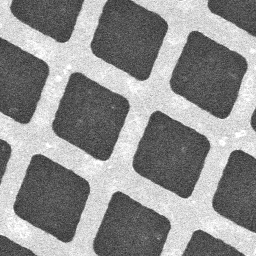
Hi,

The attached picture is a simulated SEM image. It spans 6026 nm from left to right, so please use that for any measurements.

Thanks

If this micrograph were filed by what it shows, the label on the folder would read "holes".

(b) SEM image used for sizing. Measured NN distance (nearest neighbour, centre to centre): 2090 nanometers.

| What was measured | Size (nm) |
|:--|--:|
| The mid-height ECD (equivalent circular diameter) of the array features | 1770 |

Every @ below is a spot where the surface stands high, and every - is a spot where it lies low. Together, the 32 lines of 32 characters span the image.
@---------@@@----@@@@@@@@@------
@---------@@@------@@@@@@@------
@@--------@@---------@@@@@@@----
@@@@-----@@@---------@@@@@@@@@--
@@@@@@---@@@---------@@---@@@@@@
--@@@@@@@@@---------@@@-----@@@@
---@@@@@@@@---------@@@-------@@
-----@@@@@@@@-------@@---------@
------@@@@@@@@@----@@@---------@
------@@@--@@@@@---@@---------@@
------@@----@@@@@@@@@---------@@
-----@@@------@@@@@@@@--------@@
-----@@@--------@@@@@@@-------@@
----@@@---------@@@@@@@@@----@@@
@---@@@---------@@@--@@@@@@--@@-
@@@@@@----------@@-----@@@@@@@@-
@@@@@@@--------@@@-------@@@@@@@
@@@@@@@@-------@@---------@@@@@@
-@@@@@@@@@----@@@---------@@@@@@
-@@@--@@@@@---@@@---------@@@---
-@@@---@@@@@@@@@@---------@@----
-@@------@@@@@@@@--------@@@----
@@@--------@@@@@@@@------@@-----
@@---------@@@@@@@@@----@@@-----
@@---------@@@--@@@@@@--@@@-----
@@---------@@@----@@@@@@@@@-----
@@--------@@@-------@@@@@@@-----
@@@-------@@@--------@@@@@@@@---
@@@@@-----@@---------@@@@@@@@@--
-@@@@@@--@@@---------@@@---@@@@@
--@@@@@@@@@@---------@@------@@@
----@@@@@@@@--------@@@-------@@